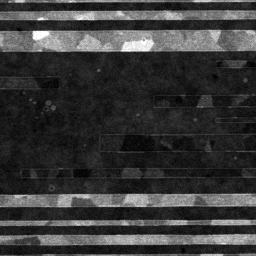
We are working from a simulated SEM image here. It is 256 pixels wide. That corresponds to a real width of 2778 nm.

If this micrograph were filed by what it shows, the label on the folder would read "groups of lines, slits or small figures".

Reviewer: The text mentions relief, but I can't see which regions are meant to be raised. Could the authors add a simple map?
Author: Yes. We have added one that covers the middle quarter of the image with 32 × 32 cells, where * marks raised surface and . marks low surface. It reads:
................................
................................
................................
................................
................................
................................
................................
................................
......................**********
.......................*********
.......................*********
................................
................................
................................
................................
................................
................................
................................
.........***********************
.........***********************
.........***********************
.........***********************
................................
................................
................................
................................
********************************
********************************
................................
................................
................................
................................